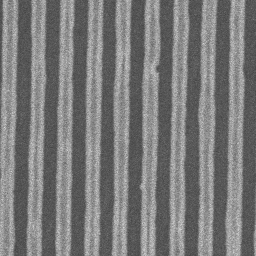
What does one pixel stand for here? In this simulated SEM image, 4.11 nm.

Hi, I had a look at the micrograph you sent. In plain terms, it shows parallel lines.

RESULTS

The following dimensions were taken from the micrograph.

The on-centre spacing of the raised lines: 117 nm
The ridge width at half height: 0.0441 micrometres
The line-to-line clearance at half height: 71.6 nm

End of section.